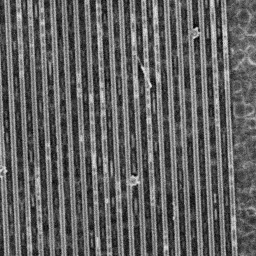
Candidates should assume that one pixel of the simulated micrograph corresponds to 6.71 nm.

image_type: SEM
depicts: parallel lines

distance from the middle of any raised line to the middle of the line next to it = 76.4 nm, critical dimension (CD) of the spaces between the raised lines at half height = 6.75 pixels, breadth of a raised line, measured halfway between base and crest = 26 nanometers